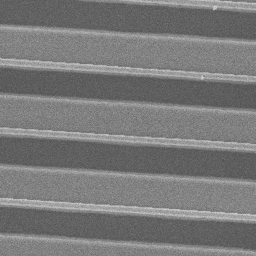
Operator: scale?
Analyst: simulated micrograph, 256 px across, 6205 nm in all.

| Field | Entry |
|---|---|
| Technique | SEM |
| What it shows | lines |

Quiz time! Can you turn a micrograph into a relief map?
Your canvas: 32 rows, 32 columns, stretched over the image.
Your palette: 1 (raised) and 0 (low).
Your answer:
00000000000000000000011111111111
00000000000000000000000000000000
00000000000000000000000000000000
11000000000000000000000000000000
11111111111111111100000000000000
11111111111111111111111111111111
11111111111111111111111111111111
11111111111111111111111111111111
00000111111111111111111111111111
00000000000000000000011111111111
00000000000000000000000000000000
00000000000000000000000000000000
11111111100000000000000000000000
11111111111111111111111110000000
11111111111111111111111111111111
11111111111111111111111111111111
11111111111111111111111111111111
00000000000001111111111111111111
00000000000000000000000000011111
00000000000000000000000000000000
00000000000000000000000000000000
11111111110000000000000000000000
11111111111111111111111111000000
11111111111111111111111111111111
11111111111111111111111111111111
11111111111111111111111111111111
00000000000000011111111111111111
00000000000000000000000000000011
00000000000000000000000000000000
10000000000000000000000000000000
11111111111111111000000000000000
11111111111111111111111111111111